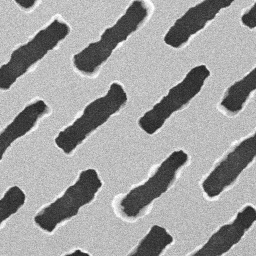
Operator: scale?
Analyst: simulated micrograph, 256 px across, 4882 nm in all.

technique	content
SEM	holes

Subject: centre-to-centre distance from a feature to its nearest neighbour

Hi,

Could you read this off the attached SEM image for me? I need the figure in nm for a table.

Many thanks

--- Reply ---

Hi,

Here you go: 1610